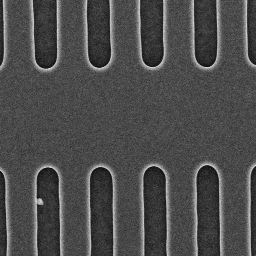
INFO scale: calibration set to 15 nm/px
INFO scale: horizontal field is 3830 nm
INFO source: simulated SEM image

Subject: groups of lines, slits or small figures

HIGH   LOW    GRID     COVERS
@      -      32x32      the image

@@@@---@@@@---@@@---@@@@---@@@@-
@@@@---@@@@---@@@---@@@@---@@@@-
@@@@---@@@@---@@@---@@@@---@@@@-
@@@@---@@@@---@@@---@@@@---@@@@-
@@@@---@@@@---@@@@--@@@@---@@@@-
-@@@---@@@@---@@@@--@@@@---@@@@-
@@@@---@@@@---@@@@--@@@@---@@@@-
@@@@---@@@@---@@@@--@@@@@--@@@@-
@@@@@-@@@@@@@@@@@@@@@@@@@@@@@@@@
@@@@@@@@@@@@@@@@@@@@@@@@@@@@@@@@
@@@@@@@@@@@@@@@@@@@@@@@@@@@@@@@@
@@@@@@@@@@@@@@@@@@@@@@@@@@@@@@@@
@@@@@@@@@@@@@@@@@@@@@@@@@@@@@@@@
@@@@@@@@@@@@@@@@@@@@@@@@@@@@@@@@
@@@@@@@@@@@@@@@@@@@@@@@@@@@@@@@@
@@@@@@@@@@@@@@@@@@@@@@@@@@@@@@@@
@@@@@@@@@@@@@@@@@@@@@@@@@@@@@@@@
@@@@@@@@@@@@@@@@@@@@@@@@@@@@@@@@
@@@@@@@@@@@@@@@@@@@@@@@@@@@@@@@@
@@@@@@@@@@@@@@@@@@@@@@@@@@@@@@@@
@@@@@@@@@@@@@@@@@@@@@@@@@@@@@@@@
@@@@@--@@@@@--@@@@--@@@@@--@@@@-
-@@@@--@@@@---@@@@---@@@@--@@@@-
-@@@@--@@@@---@@@@---@@@@---@@@-
-@@@@--@@@@---@@@@---@@@@---@@@-
-@@@@---@@@---@@@@---@@@@---@@@-
-@@@@---@@@---@@@@---@@@@---@@@-
-@@@@---@@@---@@@@---@@@@---@@@-
-@@@@---@@@---@@@@---@@@@---@@@-
-@@@@---@@@---@@@@---@@@@---@@@-
-@@@@---@@@---@@@@---@@@@---@@@-
-@@@@---@@@---@@@@---@@@@---@@@-